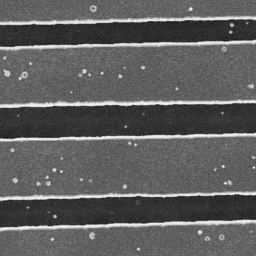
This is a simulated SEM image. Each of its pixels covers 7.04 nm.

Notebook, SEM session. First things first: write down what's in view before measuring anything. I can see lines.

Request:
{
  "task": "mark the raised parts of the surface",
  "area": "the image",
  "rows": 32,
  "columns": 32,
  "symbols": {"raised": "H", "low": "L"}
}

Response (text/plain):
HHHHHHHHHHHHHHHHHHHHHHHHHHHHHHHH
HHHHHHHHHHHHHHHHHHHHHHHHHHHHHHHH
HHHHHHHHHHHHHHHHHHHHHHLLLLLLLLLL
LLLLLLLLLLLLLLLLLLLLLLLLLLLLLLLL
LLLLLLLLLLLLLLLLLLLLLLLLLLLLLLLL
LLLLLLLLLLLLLLLLLHHHHHHHHHHHHHHH
HHHHHHHHHHHHHHHHHHHHHHHHHHHHHHHH
HHHHHHHHHHHHHHHHHHHHHHHHHHHHHHHH
HHHHHHHHHHHHHHHHHHHHHHHHHHHHHHHH
HHHHHHHHHHHHHHHHHHHHHHHHHHHHHHHH
HHHHHHHHHHHHHHHHHHHHHHHHHHHHHHHH
HHHHHHHHHHHHHHHHHHHHHHHHHHHHHHHH
HHHHHHHHHHHHHHHHHHHHHHHHHHHHHHHH
LLLLLLLLLLLLLLLLLLLLLLLLLLLLLLLL
LLLLLLLLLLLLLLLLLLLLLLLLLLLLLLLL
LLLLLLLLLLLLLLLLLLLLLLLLLLLLLLLL
LLLLLLLLLLLLLLLLLLLLLLLLLLLLLLLL
HHHHHHHHHHHHHHHHHHHHHHHHHHHHHHHH
HHHHHHHHHHHHHHHHHHHHHHHHHHHHHHHH
HHHHHHHHHHHHHHHHHHHHHHHHHHHHHHHH
HHHHHHHHHHHHHHHHHHHHHHHHHHHHHHHH
HHHHHHHHHHHHHHHHHHHHHHHHHHHHHHHH
HHHHHHHHHHHHHHHHHHHHHHHHHHHHHHHH
HHHHHHHHHHHHHHHHHHHHHHHHHHHHHHHH
HHHHHHHHHHHHHHHHLLHHHHLLLLLLLLLL
LLLLLLLLLLLLLLLLLLLLLLLLLLLLLLLL
LLLLLLLLLLLLLLLLLLLLLLLLLLLLLLLL
LLLLLLLLLLLLLLLLLLLLLLLLLLLLLLLL
LHHHHHHHHHHHHHHHHHHHHHHHHHHHHHHH
HHHHHHHHHHHHHHHHHHHHHHHHHHHHHHHH
HHHHHHHHHHHHHHHHHHHHHHHHHHHHHHHH
HHHHHHHHHHHHHHHHHHHHHHHHHHHHHHHH